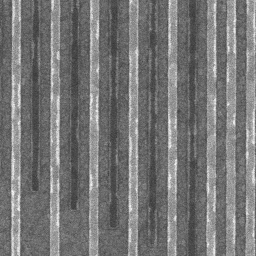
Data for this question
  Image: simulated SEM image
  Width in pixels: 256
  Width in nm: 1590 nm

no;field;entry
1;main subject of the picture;parallel lines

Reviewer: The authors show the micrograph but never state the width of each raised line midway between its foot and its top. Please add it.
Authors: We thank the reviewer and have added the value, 52.8 nm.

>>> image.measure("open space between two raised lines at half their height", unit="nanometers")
69.1